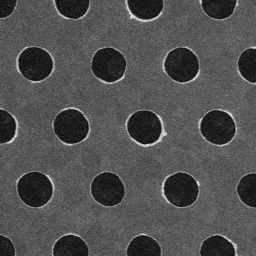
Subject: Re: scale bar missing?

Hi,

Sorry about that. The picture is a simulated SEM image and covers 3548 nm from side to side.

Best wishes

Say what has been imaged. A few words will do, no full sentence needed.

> a regular array of holes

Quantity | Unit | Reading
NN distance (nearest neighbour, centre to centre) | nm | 1000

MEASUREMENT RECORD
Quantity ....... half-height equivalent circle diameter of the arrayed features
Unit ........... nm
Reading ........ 484